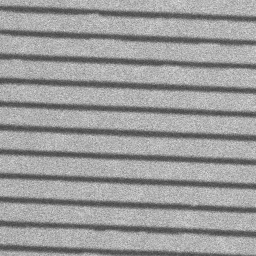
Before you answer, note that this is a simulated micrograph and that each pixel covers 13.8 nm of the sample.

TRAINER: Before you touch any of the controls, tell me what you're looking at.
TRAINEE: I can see parallel lines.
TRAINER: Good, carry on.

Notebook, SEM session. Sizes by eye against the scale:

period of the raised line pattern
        329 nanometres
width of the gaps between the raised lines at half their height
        87.9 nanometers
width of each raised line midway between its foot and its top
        241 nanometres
